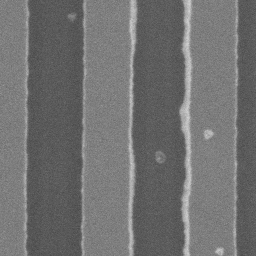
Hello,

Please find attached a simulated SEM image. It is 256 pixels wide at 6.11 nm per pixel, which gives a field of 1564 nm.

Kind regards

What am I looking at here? lines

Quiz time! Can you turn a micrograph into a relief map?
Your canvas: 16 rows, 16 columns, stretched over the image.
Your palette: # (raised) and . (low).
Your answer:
##...###....###.
##...###....###.
##...###....###.
##...###....###.
##...###....###.
##...###....###.
##...###....###.
##...###....###.
##...###....###.
##...###....###.
##...###....###.
##...###....###.
##...###....###.
##...###....###.
##...###....###.
##...###....###.